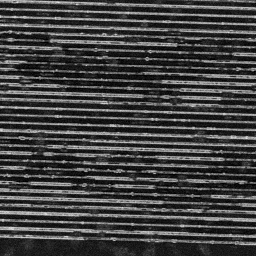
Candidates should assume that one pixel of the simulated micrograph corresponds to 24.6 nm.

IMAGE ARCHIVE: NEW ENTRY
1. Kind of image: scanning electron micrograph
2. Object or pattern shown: parallel lines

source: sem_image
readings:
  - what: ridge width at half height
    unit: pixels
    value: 1.63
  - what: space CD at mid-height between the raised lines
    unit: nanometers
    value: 144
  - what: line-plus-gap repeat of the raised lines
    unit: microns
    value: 0.186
